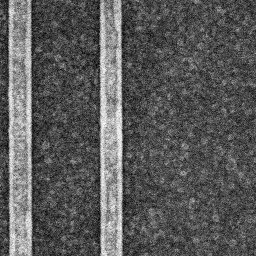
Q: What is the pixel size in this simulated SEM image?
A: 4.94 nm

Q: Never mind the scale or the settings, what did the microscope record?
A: one or a few lines or trenches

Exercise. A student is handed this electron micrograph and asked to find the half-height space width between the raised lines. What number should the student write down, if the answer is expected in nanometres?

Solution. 359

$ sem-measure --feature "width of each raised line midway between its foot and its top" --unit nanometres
89.6